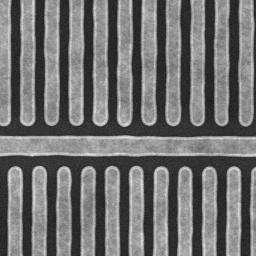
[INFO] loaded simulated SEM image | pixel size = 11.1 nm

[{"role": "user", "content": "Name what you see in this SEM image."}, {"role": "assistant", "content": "groups of lines, slits or small figures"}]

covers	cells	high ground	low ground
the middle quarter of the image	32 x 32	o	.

..ooo...ooo..oooo...ooo...ooo...
..ooo...ooo..oooo...ooo...ooo...
..ooo...ooo..oooo...ooo...ooo...
..ooo...ooo..oooo...ooo...ooo...
.oooo...ooo..oooo...ooo...ooo...
.oooo...ooo..oooo...ooo...ooo...
.oooo...ooo..oooo...ooo...ooo...
.oooo...ooo...ooo...ooo...ooo...
.oooo...ooo...ooo...ooo...ooo...
..ooo...ooo...ooo...ooo...ooo...
..ooo...ooo...ooo...ooo...ooo...
..ooo...ooo...ooo...ooo...ooo...
..ooo...ooo..oooo...ooo...ooo...
..ooo...ooo..oooo...ooo...ooo...
..oo....oo....ooo...ooo...ooo...
................................
................................
................................
ooooooooooooooooooooooooo.ooo...
oooooooooooooooooooooooooooooooo
oooooooooooooooooooooooooooooooo
oooooooooooooooooooooooooooooooo
oooooooooooooooooooooooooooooooo
................................
................................
................................
o....ooo...oo....oo....ooo...ooo
oo...ooo...ooo...ooo...ooo...ooo
oo..oooo...ooo...ooo...ooo...ooo
oo..oooo...ooo...ooo...ooo...ooo
oo..oooo...ooo...ooo...ooo...ooo
o...oooo...ooo...ooo...ooo...ooo